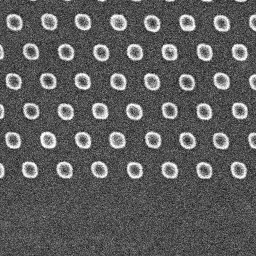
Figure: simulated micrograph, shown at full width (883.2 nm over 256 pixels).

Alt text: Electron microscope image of a regular array of raised bodies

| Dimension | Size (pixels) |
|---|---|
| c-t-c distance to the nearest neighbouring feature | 33.7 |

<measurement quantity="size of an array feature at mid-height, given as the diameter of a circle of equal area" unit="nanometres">54.2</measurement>